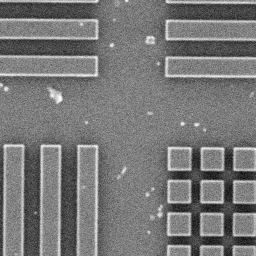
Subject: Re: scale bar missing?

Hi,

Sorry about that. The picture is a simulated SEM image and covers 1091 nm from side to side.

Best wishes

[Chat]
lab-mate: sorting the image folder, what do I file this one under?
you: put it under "groups of lines, slits or small figures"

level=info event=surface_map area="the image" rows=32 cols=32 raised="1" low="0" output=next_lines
00000000000000000000000000000000
00000000000000000000000000000000
11111111100000000000000000000000
11111111111100000000011111111111
11111111111100000000011111111111
00000000000000000000000000000000
00000000000000000000000000000000
11111111111100000000011111111111
11111111111100000000011111111111
00000000000000000000001111111111
00000000000000000000000000000000
00000000000000000000000000000000
00000000000000000000000000000000
00000000000000000000000000000000
00000000000000000000000000000000
00000000000000000000000000000000
00000000000000000000000000000000
00000000000000000000000000000000
01100111001100000000000000000000
01100111001100000000011101110111
01100111001100000000011101110111
01100111001100000000000000000000
01100111001100000000000000000000
01100111001100000000011101110111
01100111001100000000011101110111
01100110001100000000000000000000
01100110001100000000000000000000
01100110001100000000011101110111
01100110001100000000011101110111
01100110001100000000000000000011
01100110001100000000000000000000
01100110001100000000011101110111